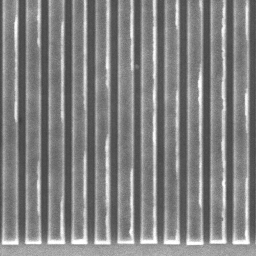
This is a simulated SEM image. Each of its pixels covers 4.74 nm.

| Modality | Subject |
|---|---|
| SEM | parallel lines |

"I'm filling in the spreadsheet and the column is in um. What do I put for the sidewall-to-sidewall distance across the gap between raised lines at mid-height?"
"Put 0.0397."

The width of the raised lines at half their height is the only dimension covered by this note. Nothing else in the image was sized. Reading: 71.1 nanometres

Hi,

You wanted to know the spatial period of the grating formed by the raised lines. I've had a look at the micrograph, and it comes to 110 nanometres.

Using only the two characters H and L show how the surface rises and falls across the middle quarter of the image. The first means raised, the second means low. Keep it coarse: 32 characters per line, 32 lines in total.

LLHHHHLLHHHLLLHHHLLLHHHLLHHHHLLH
LLHHHHLLHHHLLLHHHLLLHHHLLHHHHLLH
LLHHHHLLHHHLLLHHHLLLHHHLLHHHHLLH
LLHHHHLLHHHLLLHHHLLLHHHLLHHHHLLH
LLHHHHLLHHHLLLHHHLLLHHHLLHHHHLLH
LLHHHHLLHHHLLLHHHLLLHHHLLHHHHLLH
LLHHHHLLHHHLLLHHHLLLHHHLLHHHHLLH
LLHHHHLLHHHLLLHHHLLLHHHLLHHHHLLH
LLHHHHLLHHHLLLHHHLLLHHHLLHHHHLLH
LLHHHHLLHHHLLLHHHLLLHHHLLHHHHLLH
LLHHHHLLHHHLLLHHHLLLHHHLLHHHHLLH
LLHHHHLLHHHLLLHHHLLLHHHLLHHHHLLH
LLHHHHLLHHHLLLHHHLLLHHHLLHHHHLLH
LLHHHHLLHHHLLLHHHLLLHHHLLHHHHLLH
LLHHHHLLHHHLLLHHHLLLHHHLLHHHHLLH
LLHHHHLLHHHLLLHHHLLLHHHLLHHHHLLH
LLHHHHLLHHHLLLHHHLLLHHHLLHHHHLLH
LLHHHHLLHHHLLLHHHLLLHHHLLHHHHLLH
LLHHHHLLHHHLLLHHHLLLHHHLLHHHHLLH
LLHHHHLLHHHLLLHHHLLLHHHLLHHHHLLH
LLHHHHLLHHHLLLHHHLLLHHHLLHHHHLLH
LLHHHHLLHHHLLLHHHLLLHHHLLHHHHLLH
LLHHHHLLHHHLLLHHHLLLHHHLLHHHHLLH
LLHHHHLLHHHLLLHHHLLLHHHLLHHHHLLH
LLHHHHLLHHHLLLHHHLLLHHHLLHHHHLLH
LLHHHHLLHHHLLLHHHLLLHHHLLHHHHLLH
LLHHHHLLHHHLLLHHHLLLHHHLLHHHHLLH
LLHHHHLLHHHLLLHHHLLLHHHLLHHHHLLH
LLHHHHLLHHHLLLHHHLLLHHHLLHHHHLLH
LLHHHHLLHHHLLLHHHLLHHHHLLHHHHLLH
LLHHHHLLHHHLLLHHHLLHHHHLLHHHHLLH
LLHHHHLLHHHLLLHHHLLHHHHLLHHHHLLH